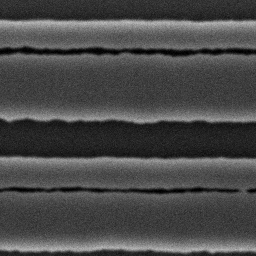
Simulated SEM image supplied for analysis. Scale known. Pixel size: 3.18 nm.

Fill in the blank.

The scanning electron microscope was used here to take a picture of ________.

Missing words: lines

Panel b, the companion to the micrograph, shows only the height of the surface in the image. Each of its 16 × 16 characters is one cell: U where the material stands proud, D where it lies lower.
DDDDDDDDDDDDDDDD
UUUUUUUUUUUUUUUU
UUUUUUUUUUUUUUUU
UUUUUUUUUUUUUUUU
UUUUUUUUUUUUUUUU
UUUUUUUUUUUUUUUU
UUUUUUUUUUUUUUUU
DDDDUUDDUUUUDUUU
DDDDDDDDDDDDDDDD
DDDDDDDDDDDDDDDD
UUUUUUUUUUUUUUUU
UUUUUUUUUUUUUUUU
UUUUUUUUUUUUUUUU
UUUUUUUUUUUUUUUU
UUUUUUUUUUUUUUUU
UUUUUUUUUUUUUUUU